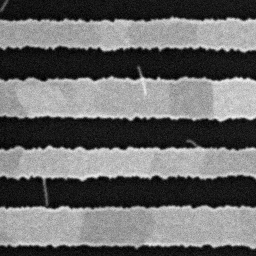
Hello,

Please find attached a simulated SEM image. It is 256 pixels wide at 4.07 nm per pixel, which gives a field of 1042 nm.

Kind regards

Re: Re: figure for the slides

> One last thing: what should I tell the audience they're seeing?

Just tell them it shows lines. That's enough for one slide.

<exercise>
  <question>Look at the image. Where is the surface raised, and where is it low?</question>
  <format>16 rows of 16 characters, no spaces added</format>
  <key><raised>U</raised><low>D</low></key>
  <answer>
DDDDDDDDDDDDDDDD
UUUUUUUUUUUUUUUU
UUUUUUUUUUUUUUUU
DDDDDDDDDDDDDDDD
DDDDDDDDDDDDDDDD
UUUUUUUUUUUUUUUU
UUUUUUUUUUUUUUUU
DDDDDDDDDDDDDUDD
DDDDDDDDDDDDDDDD
UUUUUUUUUUUUUUUU
UUUUUUUUUUUUUUUU
DDDDDDDDDDDDDDDD
DDDDDDDDDDDDDDDD
UUUUUUUUUUUUUUUU
UUUUUUUUUUUUUUUU
DDDDDDDDDDDDDDDD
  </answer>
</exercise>